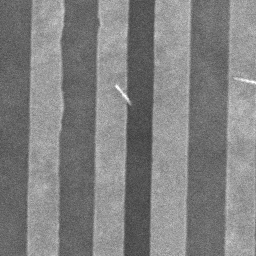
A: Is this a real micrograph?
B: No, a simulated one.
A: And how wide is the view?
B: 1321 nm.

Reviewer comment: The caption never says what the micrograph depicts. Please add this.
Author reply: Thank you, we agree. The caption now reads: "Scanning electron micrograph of one or a few lines or trenches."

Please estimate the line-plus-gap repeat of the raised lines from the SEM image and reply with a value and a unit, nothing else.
0.326 micrometres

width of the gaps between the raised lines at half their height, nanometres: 185